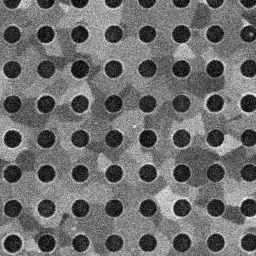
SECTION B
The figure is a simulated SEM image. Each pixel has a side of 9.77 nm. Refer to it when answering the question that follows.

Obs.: a regular array of holes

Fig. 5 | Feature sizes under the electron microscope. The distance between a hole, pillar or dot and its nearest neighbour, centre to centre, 0.329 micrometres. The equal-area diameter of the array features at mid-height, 181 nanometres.